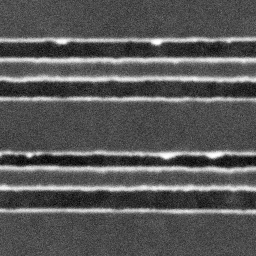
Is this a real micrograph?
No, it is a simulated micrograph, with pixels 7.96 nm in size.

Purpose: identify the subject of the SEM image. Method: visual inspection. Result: lines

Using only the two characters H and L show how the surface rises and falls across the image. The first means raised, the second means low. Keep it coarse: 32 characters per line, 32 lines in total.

HHHHHHHHHHHHHHHHHHHHHHHHHHHHHHHH
HHHHHHHHHHHHHHHHHHHHHHHHHHHHHHHH
HHHHHHHHHHHHHHHHHHHHHHHHHHHHHHHH
HHHHHHHHHHHHHHHHHHHHHHHHHHHHHHHH
HHHHHHHHHHHHHHHHHHHHHHHHHHHHHHHH
LLLLLLLLLLLLLLLLLLLLLLLLLLLLLLLL
LLLLLLLLLLLLLLLLLLLLLLLLLLLLLLLL
HHHHHHHHHHHHHHHHHHHHHHHHHHHHHHHH
HHHHHHHHHHHHHHHHHHHHHHHHHHHHHHHH
HHHHHHHHHHHHHHHHHHHHHHHHHHHHHHHH
LLLLLLLLLLLLLLLLLLLLLLLLLLLLLLLL
LLLLLLLLLLLLLLLLLLLLLLLLLLLLLLLL
HHHHHHHHHHHHHHHHHHHHHHHHHHHHHHHH
HHHHHHHHHHHHHHHHHHHHHHHHHHHHHHHH
HHHHHHHHHHHHHHHHHHHHHHHHHHHHHHHH
HHHHHHHHHHHHHHHHHHHHHHHHHHHHHHHH
HHHHHHHHHHHHHHHHHHHHHHHHHHHHHHHH
HHHHHHHHHHHHHHHHHHHHHHHHHHHHHHHH
HHHHHHHHHHHHHHHHHHHHHHHHHHHHHHHH
LLLLLLLLLLLLLLLLLLLLLLLLLLLLLLLL
LLLLLLLLLLLLLLLLLLLLLLLLLLLLLLLL
HHHHHHHHHHHHHHHHHHHHHHHHHHHHHHHH
HHHHHHHHHHHHHHHHHHHHHHHHHHHHHHHH
HHHHHHHHHHHHHHHHHHHHHHHHHHHHHHHH
LLLLLLLLLLLLLLLLLLLLLLLLLLLLLLLL
LLLLLLLLLLLLLLLLLLLLLLLLLLLLLLLL
HHHHHHHHHHHHHHHHHHHHHHHHHHHHHHHH
HHHHHHHHHHHHHHHHHHHHHHHHHHHHHHHH
HHHHHHHHHHHHHHHHHHHHHHHHHHHHHHHH
HHHHHHHHHHHHHHHHHHHHHHHHHHHHHHHH
HHHHHHHHHHHHHHHHHHHHHHHHHHHHHHHH
HHHHHHHHHHHHHHHHHHHHHHHHHHHHHHHH